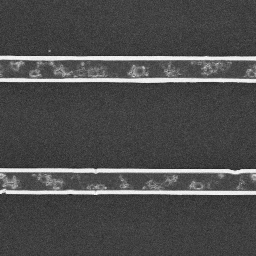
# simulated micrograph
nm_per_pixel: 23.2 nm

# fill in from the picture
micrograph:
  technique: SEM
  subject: one or a few lines or trenches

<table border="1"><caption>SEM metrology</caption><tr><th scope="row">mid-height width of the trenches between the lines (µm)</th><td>2.08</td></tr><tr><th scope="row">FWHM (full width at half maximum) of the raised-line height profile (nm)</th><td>526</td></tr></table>